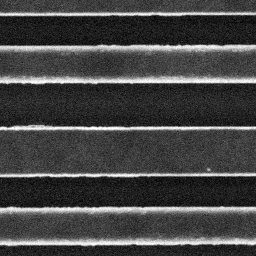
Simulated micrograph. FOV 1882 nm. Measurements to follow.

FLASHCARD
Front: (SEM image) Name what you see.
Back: lines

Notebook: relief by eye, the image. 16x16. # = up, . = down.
################
................
................
################
################
................
................
................
################
################
################
................
................
################
################
................